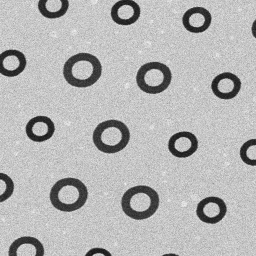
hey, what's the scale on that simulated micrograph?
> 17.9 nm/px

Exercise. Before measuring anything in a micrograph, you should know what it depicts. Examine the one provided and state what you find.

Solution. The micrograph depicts a regular array of ring-shaped grooves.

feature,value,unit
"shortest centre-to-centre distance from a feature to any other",1.28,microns